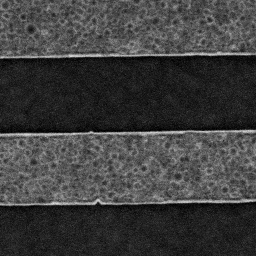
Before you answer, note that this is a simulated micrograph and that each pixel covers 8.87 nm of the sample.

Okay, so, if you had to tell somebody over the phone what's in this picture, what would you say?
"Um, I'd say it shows one or a few lines or trenches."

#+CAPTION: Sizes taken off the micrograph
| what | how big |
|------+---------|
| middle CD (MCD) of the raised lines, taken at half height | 633 nm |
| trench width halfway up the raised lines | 683 nm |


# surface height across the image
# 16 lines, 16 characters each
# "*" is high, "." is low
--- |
****************
****************
****************
******..........
................
................
................
................
****************
****************
****************
****************
****************
................
................
................